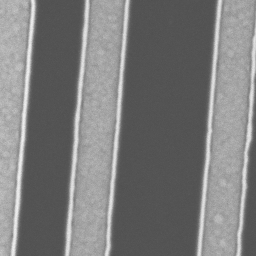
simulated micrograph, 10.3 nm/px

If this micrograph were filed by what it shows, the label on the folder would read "one or a few lines or trenches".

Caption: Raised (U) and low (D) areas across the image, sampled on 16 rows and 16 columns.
DDUUUDDDUUUUUUDD
DDUUUDDDUUUUUUDD
DDUUUDDDUUUUUUDD
DDUUUDDDUUUUUDDD
DDUUUDDDUUUUUDDD
DDUUUDDUUUUUUDDD
DDUUUDDUUUUUUDDD
DUUUUDDUUUUUUDDD
DUUUUDDUUUUUUDDD
DUUUUDDUUUUUUDDU
DUUUUDDUUUUUUDDU
DUUUUDDUUUUUUDDU
DUUUUDDUUUUUUDDU
DUUUDDDUUUUUUDDU
DUUUDDDUUUUUUDDU
DUUUDDDUUUUUDDDU